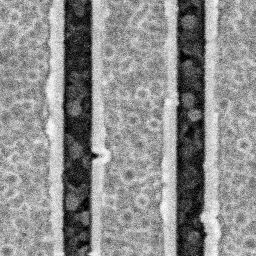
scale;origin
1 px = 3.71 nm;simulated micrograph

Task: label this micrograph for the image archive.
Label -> one or a few lines or trenches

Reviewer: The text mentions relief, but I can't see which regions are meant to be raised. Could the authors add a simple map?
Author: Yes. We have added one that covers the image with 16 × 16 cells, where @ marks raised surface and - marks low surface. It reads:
@@@@--@@@@@--@@@
@@@@--@@@@@--@@@
@@@@--@@@@@--@@@
@@@@--@@@@@--@@@
@@@@--@@@@@--@@@
@@@@--@@@@@--@@@
@@@@--@@@@@--@@@
@@@@--@@@@@--@@@
@@@@--@@@@@--@@@
@@@@--@@@@@--@@@
@@@@--@@@@@--@@@
@@@@--@@@@@--@@@
@@@@--@@@@@--@@@
@@@@--@@@@@--@@@
@@@@--@@@@@--@@@
@@@@--@@@@@--@@@